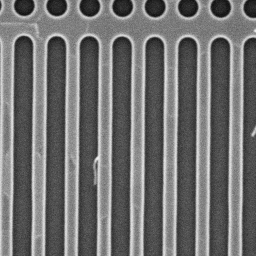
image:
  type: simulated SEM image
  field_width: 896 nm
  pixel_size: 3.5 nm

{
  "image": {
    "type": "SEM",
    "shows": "groups of lines, slits or small figures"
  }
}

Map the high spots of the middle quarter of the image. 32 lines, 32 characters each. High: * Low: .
.**......***.....***.....***....
.**......***.....***.....***....
.**......***.....***.....***....
.**......***.....***.....***....
.**......***.....***.....***....
.**......***.....***.....***....
.**......***.....***.....***....
.**......***.....***.....***....
.**......***.....***.....***....
.**......***.....***.....***....
.**......***.....***.....***....
.**......***.....***.....***....
.**......***.....***.....***....
.**......***.....***.....***....
.**......***.....***.....***....
.**......***.....***.....***....
.**......***.....***.....***....
.**......***.....***.....***....
.**......***.....***.....***....
.**......***.....***.....***....
.**......***.....***.....***....
.**......***.....***.....***....
.**......***.....***.....***....
.**.....****.....***.....***....
.**......***.....***.....***....
.**......***.....***.....***....
.**......***.....***.....***....
.**......***.....***.....***....
.**......***.....***.....***....
.**......***.....***.....***....
.**......***.....***.....***....
.**......**......***.....***....